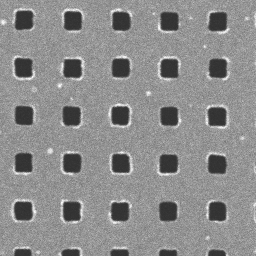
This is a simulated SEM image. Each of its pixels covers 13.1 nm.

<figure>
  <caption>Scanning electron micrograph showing a regular array of holes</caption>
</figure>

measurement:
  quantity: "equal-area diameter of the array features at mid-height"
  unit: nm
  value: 267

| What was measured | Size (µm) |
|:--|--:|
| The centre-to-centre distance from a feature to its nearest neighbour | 0.617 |